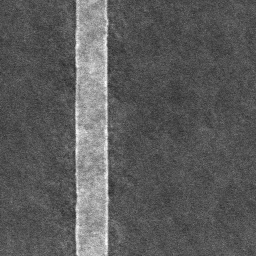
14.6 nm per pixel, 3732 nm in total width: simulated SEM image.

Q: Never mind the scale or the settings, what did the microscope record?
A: one or a few lines or trenches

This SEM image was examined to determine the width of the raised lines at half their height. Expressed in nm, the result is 433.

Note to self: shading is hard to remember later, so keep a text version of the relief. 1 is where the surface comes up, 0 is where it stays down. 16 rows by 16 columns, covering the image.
0000011000000000
0000011000000000
0000011000000000
0000011000000000
0000011000000000
0000011000000000
0000011000000000
0000011000000000
0000011000000000
0000011000000000
0000011000000000
0000011000000000
0000011000000000
0000011000000000
0000011000000000
0000011000000000